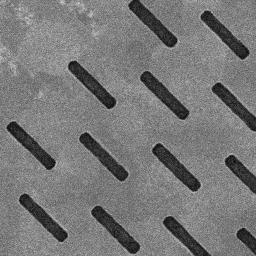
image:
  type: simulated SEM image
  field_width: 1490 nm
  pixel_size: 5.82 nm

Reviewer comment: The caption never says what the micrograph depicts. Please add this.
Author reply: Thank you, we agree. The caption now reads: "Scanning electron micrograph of a regular array of holes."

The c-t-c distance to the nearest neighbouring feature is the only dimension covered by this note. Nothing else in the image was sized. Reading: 426 nm